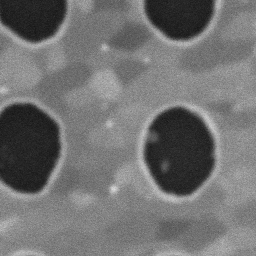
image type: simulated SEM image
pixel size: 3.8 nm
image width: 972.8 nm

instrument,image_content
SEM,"holes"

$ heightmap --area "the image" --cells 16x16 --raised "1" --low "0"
0000111110000111
0000111110000111
1001111111101111
1111111111111111
1111111111111111
1111111111111111
1011111111111111
0001111111000111
0000111110000111
0000111110000111
0001111110000111
0001111111000111
1111111111111111
1111111111111111
1111111111111111
1111111111111111